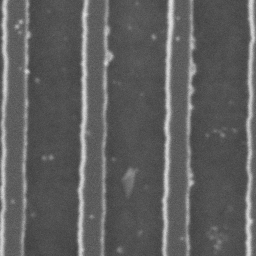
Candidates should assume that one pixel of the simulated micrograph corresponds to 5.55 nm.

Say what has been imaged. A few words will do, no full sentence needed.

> lines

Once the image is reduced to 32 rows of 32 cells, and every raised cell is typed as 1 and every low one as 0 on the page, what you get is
11100000000110000000011100000001
11100000001110000000011100000001
11100000001110000000011100000001
11100000001110000000011100000001
11100000001110000000011100000001
11100000001110000000011100000001
11100000001110000000011100000001
01100000001110000000011100000001
01100000001110000000011100000001
01100000001110000000011100000001
01100000001110000000011100000001
01100000001110000000011100000001
11100000001110000000011100000001
11100000001110000000011100000001
11100000001110000000011100000001
11100000001110000000011100000001
11100000001110000000011100000001
11100000001110000000011100000001
11100000001110000000011100000001
11100000001110000000011100000001
11100000001110000000011100000001
11100000001110000000011100000001
11100000001110000000011100000001
11100000001110000000011100000001
11100000001110000000011100000001
11100000001110000000111100000001
11100000001110000000111100000001
11100000001110000000011100000001
11100000001110000000011000000001
11100000001110000000011100000001
11100000001110000000111100000001
11100000001110000000111100000001